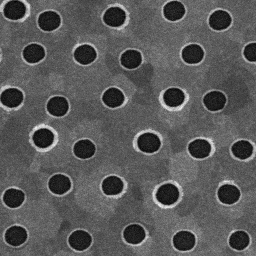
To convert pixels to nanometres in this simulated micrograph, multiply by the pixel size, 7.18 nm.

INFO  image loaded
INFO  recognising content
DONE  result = a regular array of holes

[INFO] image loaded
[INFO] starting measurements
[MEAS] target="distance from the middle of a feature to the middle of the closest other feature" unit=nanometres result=307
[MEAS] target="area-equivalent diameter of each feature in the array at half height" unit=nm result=162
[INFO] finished